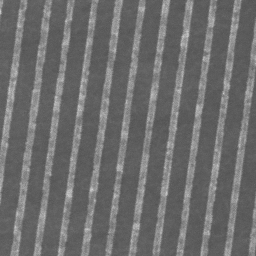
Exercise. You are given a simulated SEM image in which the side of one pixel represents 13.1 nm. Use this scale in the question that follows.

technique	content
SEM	parallel lines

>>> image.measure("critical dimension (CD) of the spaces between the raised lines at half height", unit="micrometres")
0.238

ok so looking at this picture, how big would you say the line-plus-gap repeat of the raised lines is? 307 nm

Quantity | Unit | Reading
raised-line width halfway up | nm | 63.1